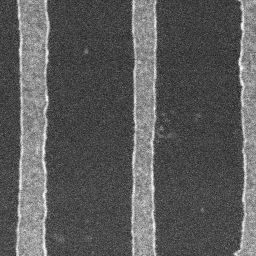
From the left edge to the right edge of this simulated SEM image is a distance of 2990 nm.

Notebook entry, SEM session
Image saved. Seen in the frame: one or a few lines or trenches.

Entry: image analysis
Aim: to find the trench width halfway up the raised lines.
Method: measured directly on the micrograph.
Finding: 1020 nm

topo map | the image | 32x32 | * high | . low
..****...........**...........**
..****...........**...........**
..****...........**...........**
..****...........**...........**
...***...........***..........**
...***...........***..........**
..****...........**...........**
...***...........**...........**
...***...........**...........**
...***...........**...........**
...***...........**...........**
...***...........**...........**
...***...........**...........**
...***...........**...........**
...***...........**...........**
...***...........**...........**
...***...........**...........**
...***...........**............*
...**............**...........**
...**............**............*
...**............**............*
...***...........**............*
...***...........**............*
...***...........**............*
..****...........**...........**
..****...........**............*
..****...........**............*
..****...........**............*
..****..........***...........**
..****...........**...........**
..****...........**...........**
..****...........**...........**